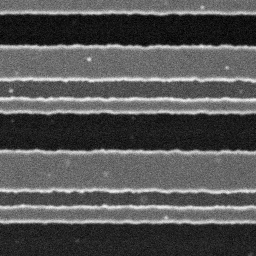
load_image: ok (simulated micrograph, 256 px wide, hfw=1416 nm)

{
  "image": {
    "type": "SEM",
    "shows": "lines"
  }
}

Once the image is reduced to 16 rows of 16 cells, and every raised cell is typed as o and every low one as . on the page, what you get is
oooooooooooooooo
................
................
oooooooooooooooo
oooooooooooooooo
oooooooooooooooo
oooooooooooooooo
................
................
oooooooooooooooo
oooooooooooooooo
oooooooooooooooo
oooooooooooooooo
oooooooooooooooo
................
................